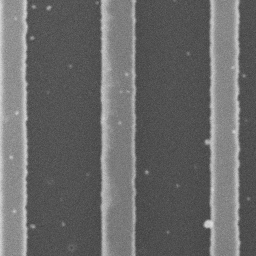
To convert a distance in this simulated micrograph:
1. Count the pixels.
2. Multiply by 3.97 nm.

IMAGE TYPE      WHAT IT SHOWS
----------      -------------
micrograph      lines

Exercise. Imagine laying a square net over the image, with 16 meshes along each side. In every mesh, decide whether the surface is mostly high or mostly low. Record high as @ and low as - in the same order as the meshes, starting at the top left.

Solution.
@@----@@-----@@-
@@----@@-----@@-
@@----@@-----@@-
@@----@@-----@@-
@@----@@-----@@-
@@----@@-----@@-
@@----@@-----@@-
@@----@@-----@@-
@@----@@-----@@-
@@----@@-----@@-
@@----@@-----@@-
@@----@@-----@@-
@@----@@-----@@-
@@----@@-----@@-
@@----@@-----@@-
@@----@@-----@@-